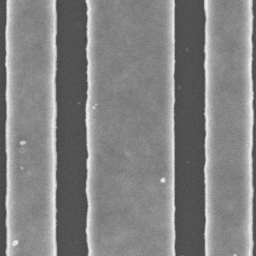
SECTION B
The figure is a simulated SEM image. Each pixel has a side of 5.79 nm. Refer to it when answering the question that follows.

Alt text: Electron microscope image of lines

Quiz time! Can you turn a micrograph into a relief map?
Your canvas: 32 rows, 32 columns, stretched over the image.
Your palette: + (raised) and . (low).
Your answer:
.++++++....+++++++++++....+++++.
.++++++....+++++++++++....++++++
.++++++....+++++++++++....++++++
.++++++....+++++++++++....+++++.
.++++++....+++++++++++....+++++.
.++++++....+++++++++++....+++++.
.++++++....+++++++++++....+++++.
.++++++....+++++++++++....+++++.
.++++++....+++++++++++....+++++.
.++++++....+++++++++++....+++++.
.++++++....+++++++++++....++++++
.++++++....+++++++++++....++++++
.++++++....+++++++++++....++++++
.++++++....+++++++++++....++++++
.++++++....+++++++++++....++++++
.++++++....+++++++++++....++++++
.++++++....+++++++++++....++++++
.++++++....+++++++++++....++++++
.++++++....+++++++++++....++++++
.++++++....+++++++++++....+++++.
.++++++....+++++++++++....+++++.
.++++++....+++++++++++....++++++
.++++++....+++++++++++....++++++
.++++++....+++++++++++....++++++
.++++++....+++++++++++....++++++
.++++++....+++++++++++....+++++.
.++++++....+++++++++++....+++++.
.++++++....+++++++++++....++++++
.++++++....+++++++++++....+++++.
.++++++....+++++++++++....++++++
.++++++....+++++++++++....++++++
.++++++....+++++++++++....++++++